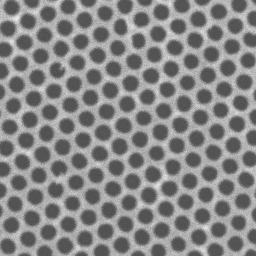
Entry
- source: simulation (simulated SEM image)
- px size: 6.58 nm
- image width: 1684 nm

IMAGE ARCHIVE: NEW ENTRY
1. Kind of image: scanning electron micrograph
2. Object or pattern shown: a regular array of holes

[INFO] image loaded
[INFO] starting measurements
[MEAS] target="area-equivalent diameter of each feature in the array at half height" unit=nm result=106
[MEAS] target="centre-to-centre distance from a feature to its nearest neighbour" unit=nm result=139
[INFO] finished